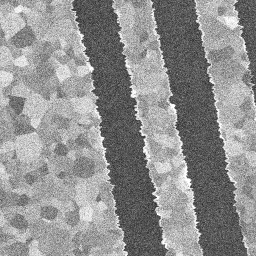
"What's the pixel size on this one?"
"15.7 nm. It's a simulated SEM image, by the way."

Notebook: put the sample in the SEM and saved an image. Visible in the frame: one or a few lines or trenches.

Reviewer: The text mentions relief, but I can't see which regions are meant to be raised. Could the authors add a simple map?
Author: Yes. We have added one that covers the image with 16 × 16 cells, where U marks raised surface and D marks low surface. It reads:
UUUUUDDUUUDDUUUD
UUUUUDDUUUDDUUUD
UUUUUDDDUUDDDUUD
UUUUUDDDUUDDDUUD
UUUUUUDDUUDDDUUU
UUUUUUDDUUUDDUUU
UUUUUUDDUUUDDUUU
UUUUUUDDDUUDDDUU
UUUUUUDDDUUDDDUU
UUUUUUUDDUUDDDUU
UUUUUUUDDUUUDDUU
UUUUUUUDDDUUDDDU
UUUUUUUDDDUUDDDU
UUUUUUUDDDUUDDDU
UUUUUUUUDDUUDDDU
UUUUUUUUDDUUUDDU